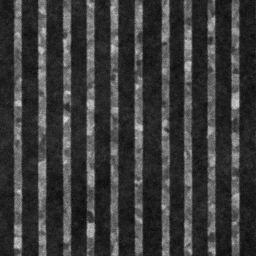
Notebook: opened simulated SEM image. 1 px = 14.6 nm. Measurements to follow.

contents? parallel lines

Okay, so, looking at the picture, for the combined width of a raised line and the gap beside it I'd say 24.2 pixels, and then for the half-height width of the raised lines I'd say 101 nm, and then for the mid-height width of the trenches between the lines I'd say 0.249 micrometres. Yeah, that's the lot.